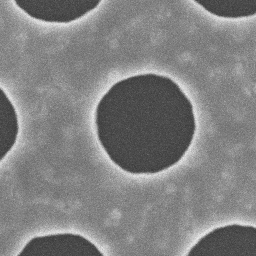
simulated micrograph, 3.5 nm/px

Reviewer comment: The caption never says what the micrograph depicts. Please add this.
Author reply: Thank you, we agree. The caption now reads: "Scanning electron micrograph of holes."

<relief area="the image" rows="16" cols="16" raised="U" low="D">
UDDDDDUUUUUUUDDD
UUUUUUUUUUUUUUUU
UUUUUUUUUUUUUUUU
UUUUUUUUUUUUUUUU
UUUUUUUUUUUUUUUU
UUUUUUUDDDDUUUUU
DUUUUUDDDDDDUUUU
DUUUUUDDDDDDUUUU
DUUUUUDDDDDDUUUU
DUUUUUUDDDDDUUUU
UUUUUUUUDDUUUUUU
UUUUUUUUUUUUUUUU
UUUUUUUUUUUUUUUU
UUUUUUUUUUUUUUUU
UUUUUUUUUUUUUDDD
UUDDDDUUUUUUDDDD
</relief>